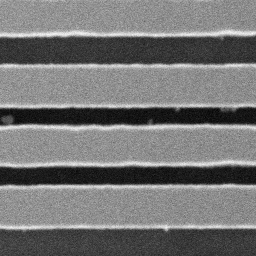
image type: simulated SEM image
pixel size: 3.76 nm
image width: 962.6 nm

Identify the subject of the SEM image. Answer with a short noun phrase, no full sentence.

lines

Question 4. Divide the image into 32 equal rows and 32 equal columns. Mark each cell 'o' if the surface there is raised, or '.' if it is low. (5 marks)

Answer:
oooooooooooooooooooooooooooooooo
oooooooooooooooooooooooooooooooo
oooooooooooooooooooooooooooooooo
oooooooooooooooooooooooooooooooo
ooooooooo..oooo..ooooooo........
................................
................................
................................
oooooooooooooooooooooooooooooooo
oooooooooooooooooooooooooooooooo
oooooooooooooooooooooooooooooooo
oooooooooooooooooooooooooooooooo
oooooooooooooooooooooooooooooooo
................................
................................
................................
oooooooooooooooooooooooooooooooo
oooooooooooooooooooooooooooooooo
oooooooooooooooooooooooooooooooo
oooooooooooooooooooooooooooooooo
oooooooooooooooooooooooooooooooo
................................
................................
oooooooooooooooooooooooooooooooo
oooooooooooooooooooooooooooooooo
oooooooooooooooooooooooooooooooo
oooooooooooooooooooooooooooooooo
oooooooooooooooooooooooooooooooo
ooooooo.....o...........oo......
................................
................................
................................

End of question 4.